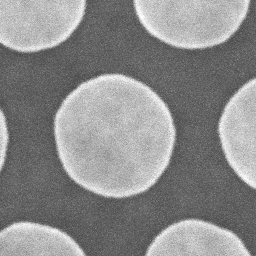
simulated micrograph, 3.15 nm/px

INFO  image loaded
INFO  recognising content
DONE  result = raised bodies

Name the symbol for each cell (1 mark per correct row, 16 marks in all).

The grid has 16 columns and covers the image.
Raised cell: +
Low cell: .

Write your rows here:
+++++....++++++.
+++++....++++++.
++++......++++..
................
................
.....++++......+
....++++++....++
....+++++++...++
....+++++++...++
....+++++++...++
....++++++.....+
.....++++.......
................
................
++++......++++..
+++++....++++++.